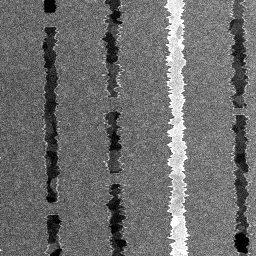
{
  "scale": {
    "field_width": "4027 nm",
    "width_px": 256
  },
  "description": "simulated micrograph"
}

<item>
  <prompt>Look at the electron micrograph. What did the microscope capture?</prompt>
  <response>parallel lines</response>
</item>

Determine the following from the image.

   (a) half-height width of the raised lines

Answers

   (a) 13.4 pixels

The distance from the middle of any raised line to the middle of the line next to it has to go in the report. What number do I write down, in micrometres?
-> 0.988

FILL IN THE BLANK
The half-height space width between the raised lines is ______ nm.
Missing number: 780